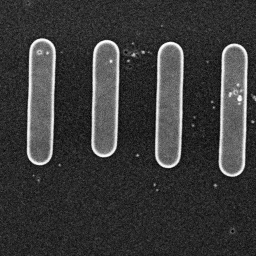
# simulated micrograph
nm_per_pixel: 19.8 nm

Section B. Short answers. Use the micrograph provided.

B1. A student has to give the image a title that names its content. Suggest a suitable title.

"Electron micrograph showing groups of lines, slits or small figures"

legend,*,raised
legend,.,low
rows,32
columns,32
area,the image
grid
................................
................................
................................
................................
................................
....**......**.......*..........
....***.....***.....***.....***.
....***.....***.....***.....***.
....***.....***.....***.....***.
....***.....***.....***.....***.
....***.....***.....***.....***.
....***.....***.....***.....***.
....***.....***.....***.....***.
....***.....***.....***.....***.
....***.....***.....***.....***.
....***.....***.....***.....***.
...****.....***.....***.....***.
...****.....***.....***.....***.
...***......**......**.....****.
....**..............**.....****.
....................**.....****.
............................**..
................................
................................
................................
................................
................................
................................
................................
................................
................................
................................